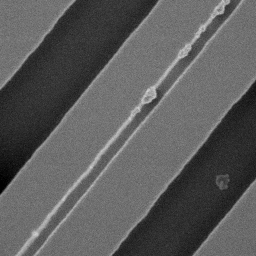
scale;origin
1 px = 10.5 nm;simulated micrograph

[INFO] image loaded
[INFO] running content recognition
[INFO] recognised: lines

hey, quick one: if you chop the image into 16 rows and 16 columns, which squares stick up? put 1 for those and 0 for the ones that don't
1111000000111111
1110000001111111
1110000011111111
1100000111111111
1000001111111111
0000001111111111
0000011111111110
0000111111111100
0001111111111000
0011111111110000
0111111111100000
0111111111100000
1111111111000001
1111111110000011
1111111100000111
1111111000001111